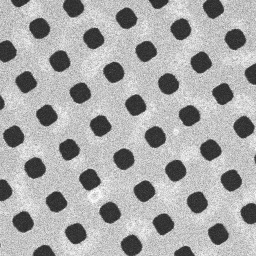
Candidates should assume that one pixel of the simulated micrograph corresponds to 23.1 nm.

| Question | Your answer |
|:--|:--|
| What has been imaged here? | a regular array of holes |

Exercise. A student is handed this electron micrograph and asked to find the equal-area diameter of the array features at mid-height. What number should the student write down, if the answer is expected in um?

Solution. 0.485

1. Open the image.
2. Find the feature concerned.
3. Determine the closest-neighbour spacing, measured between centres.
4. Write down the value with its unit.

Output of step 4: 880 nm